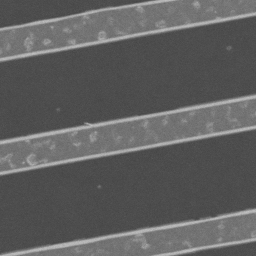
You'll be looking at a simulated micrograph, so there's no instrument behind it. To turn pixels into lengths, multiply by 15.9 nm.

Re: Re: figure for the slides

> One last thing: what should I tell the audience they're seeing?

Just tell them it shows one or a few lines or trenches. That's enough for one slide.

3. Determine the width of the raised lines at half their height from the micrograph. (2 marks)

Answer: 30.3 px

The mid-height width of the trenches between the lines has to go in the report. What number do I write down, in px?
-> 82.1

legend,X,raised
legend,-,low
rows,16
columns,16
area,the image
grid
-------XXXXXXXXX
--XXXXXXXXXXX---
XXXXXXX---------
X---------------
----------------
----------------
-------------XXX
--------XXXXXXXX
--XXXXXXXXXXX---
XXXXXXX---------
XX--------------
----------------
----------------
--------------XX
---------XXXXXXX
---XXXXXXXXXX---